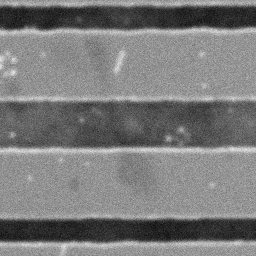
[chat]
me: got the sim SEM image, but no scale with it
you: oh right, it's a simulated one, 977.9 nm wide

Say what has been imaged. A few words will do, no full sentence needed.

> lines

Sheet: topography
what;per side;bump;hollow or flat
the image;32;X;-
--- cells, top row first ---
XXXXXXXXXXXXXXXXXXXXXXXXXXXXXXXX
--------------------------------
--------------------------------
--------------------------------
XXXXXXXXXXXXXXXXXXXXXXXXXXXXXXXX
XXXXXXXXXXXXXXXXXXXXXXXXXXXXXXXX
XXXXXXXXXXXXXXXXXXXXXXXXXXXXXXXX
XXXXXXXXXXXXXXXXXXXXXXXXXXXXXXXX
XXXXXXXXXXXXXXXXXXXXXXXXXXXXXXXX
XXXXXXXXXXXXXXXXXXXXXXXXXXXXXXXX
XXXXXXXXXXXXXXXXXXXXXXXXXXXXXXXX
XXXXXXXXXXXXXXXXXXXXXXXXXXXXXXXX
--------------------------------
--------------------------------
--------------------------------
--------------------------------
--------------------------------
--------------------------------
----------------------------X---
XXXXXXXXXXXXXXXXXXXXXXXXXXXXXXXX
XXXXXXXXXXXXXXXXXXXXXXXXXXXXXXXX
XXXXXXXXXXXXXXXXXXXXXXXXXXXXXXXX
XXXXXXXXXXXXXXXXXXXXXXXXXXXXXXXX
XXXXXXXXXXXXXXXXXXXXXXXXXXXXXXXX
XXXXXXXXXXXXXXXXXXXXXXXXXXXXXXXX
XXXXXXXXXXXXXXXXXXXXXXXXXXXXXXXX
XXXXXXXXXXXXXXXXXXXXXXXXXXXXXXXX
--------------------------------
--------------------------------
--------------------------------
XXXXXXXXXXXX-XXXXXXXXXXXXXXXXXXX
XXXXXXXXXXXXXXXXXXXXXXXXXXXXXXXX